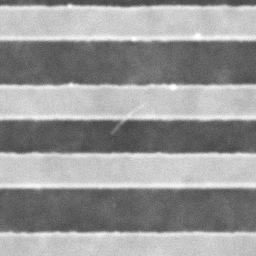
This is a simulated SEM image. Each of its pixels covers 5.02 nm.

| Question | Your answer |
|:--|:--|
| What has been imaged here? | lines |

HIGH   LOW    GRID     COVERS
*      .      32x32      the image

................................
********************************
********************************
********************************
********************************
................................
................................
................................
................................
................................
................................
********************************
********************************
********************************
********************************
................................
................................
................................
................................
********************************
********************************
********************************
********************************
................................
................................
................................
................................
................................
................................
********************************
********************************
********************************